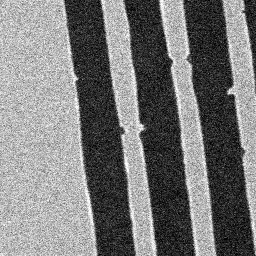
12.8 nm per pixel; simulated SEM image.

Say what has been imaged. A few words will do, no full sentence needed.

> parallel lines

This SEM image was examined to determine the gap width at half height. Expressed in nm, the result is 512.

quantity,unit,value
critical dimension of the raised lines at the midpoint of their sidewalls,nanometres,256